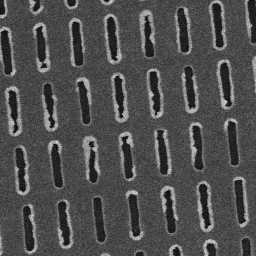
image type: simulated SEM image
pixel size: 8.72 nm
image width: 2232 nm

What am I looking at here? a regular array of holes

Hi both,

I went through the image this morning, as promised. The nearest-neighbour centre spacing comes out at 0.309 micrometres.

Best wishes